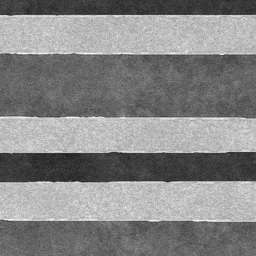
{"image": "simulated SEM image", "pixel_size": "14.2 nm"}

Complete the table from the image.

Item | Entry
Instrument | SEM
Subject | lines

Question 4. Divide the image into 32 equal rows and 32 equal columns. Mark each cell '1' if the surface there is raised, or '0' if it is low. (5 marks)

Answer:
00000000000000000000000000000000
00000000000000000000000000000000
11111111111111111111111111111111
11111111111111111111111111111111
11111111111111111111111111111111
11111111111111111111111111111111
11111111111111111111111111111111
00000000000000000000000000000000
00000000000000000000000000000000
00000000000000000000000000000000
00000000000000000000000000000000
00000000000000000000000000000000
00000000000000000000000000000000
00000000000000000000000000000000
00000000000000000000000000000000
11111111111111111111111111111111
11111111111111111111111111111111
11111111111111111111111111111111
11111111111111111111111111111111
00000000000000000000000000000000
00000000000000000000000000000000
00000000000000000000000000000000
00000000000000000000000000000000
11111111111111111111111111111111
11111111111111111111111111111111
11111111111111111111111111111111
11111111111111111111111111111111
00000000000000000011000011111111
00000000000000000000000000000000
00000000000000000000000000000000
00000000000000000000000000000000
00000000000000000000000000000000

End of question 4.